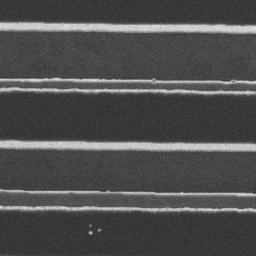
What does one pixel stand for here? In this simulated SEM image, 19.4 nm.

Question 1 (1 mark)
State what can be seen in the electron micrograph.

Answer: lines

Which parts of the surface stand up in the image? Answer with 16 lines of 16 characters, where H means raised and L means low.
HHHHHHHHHHHHHHHH
LLLLLHHHHHHHHHHH
LLLLLLLLLLLLLLLL
LLLLLLLLLLLLLLLL
LLLLLLLLLLLLLLLL
LLLLLLLLLLLLLLLL
HHHHHHHHHHHHHHHH
HHHHHHHHHHHHHHHH
HHHHHHHHHHHHHHHH
LLLLLLLLLLLLLLLL
LLLLLLLLLLLLLLLL
LLLLLLLLLLLLLLLL
LLLLLLLLLLLLLLLL
HHHHHHHHHHHHHHHH
HHHHHHHHHHHHHHHH
HHHHHHHHHHHHHHHH